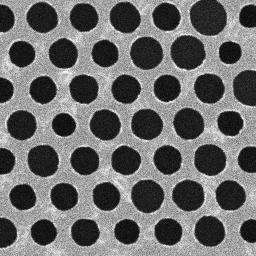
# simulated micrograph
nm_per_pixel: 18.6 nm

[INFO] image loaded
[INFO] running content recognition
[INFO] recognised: a regular array of holes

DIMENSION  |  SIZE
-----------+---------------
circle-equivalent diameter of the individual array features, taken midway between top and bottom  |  552 nm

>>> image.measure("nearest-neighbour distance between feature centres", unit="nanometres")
760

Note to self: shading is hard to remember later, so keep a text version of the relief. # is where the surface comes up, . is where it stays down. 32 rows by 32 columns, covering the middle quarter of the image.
..#######...######.....#####....
####################.##########.
################################
##......#####.....#####.....####
#.......####.......####......###
#........###.......###.......###
#........###.......###.......###
##.......###.......####......###
##......####.......####.....####
###....######.....######..######
################################
#########..########....######...
.######......#####......####....
..#####.......###.......###.....
...###........###........##.....
...###........###........##.....
...####.......###........###....
..#####......#####......####....
########.....######....######...
################################
##############..#########..#####
###.....#####.....#####......###
##.......###.......####......###
##.......###.......###........##
##.......###.......###........##
##.......###.......####......###
###.....#####.....#####......###
####...#######...########...####
################################
##########.#######.....######...
..######.....####.......####....
...####.......###........##.....